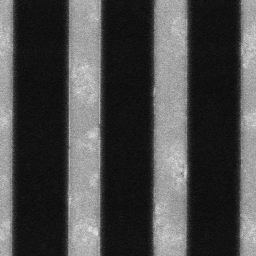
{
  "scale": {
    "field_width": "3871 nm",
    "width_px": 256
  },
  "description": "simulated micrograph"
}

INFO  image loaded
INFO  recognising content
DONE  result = one or a few lines or trenches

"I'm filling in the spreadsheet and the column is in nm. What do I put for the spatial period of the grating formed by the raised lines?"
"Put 1310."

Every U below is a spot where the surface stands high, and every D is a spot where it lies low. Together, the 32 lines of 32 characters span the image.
DDUUUUUUUDDDDUUUUUUDDDDUUUUUUUDD
DDUUUUUUUDDDDUUUUUUDDDDUUUUUUUDD
DDUUUUUUUDDDDUUUUUUDDDDUUUUUUUDD
DDUUUUUUUDDDDUUUUUUDDDDUUUUUUUDD
DDUUUUUUUDDDDUUUUUUDDDDUUUUUUUDD
DDUUUUUUUDDDDUUUUUUDDDDUUUUUUUDD
DDUUUUUUUDDDDUUUUUUDDDDUUUUUUUDD
DUUUUUUUUDDDDUUUUUUDDDDUUUUUUUDD
DUUUUUUUUDDDDUUUUUUDDDDUUUUUUUDD
DDUUUUUUUDDDDUUUUUUDDDDUUUUUUUDD
DDUUUUUUUDDDDUUUUUUDDDDUUUUUUUDD
DDUUUUUUUDDDDUUUUUUDDDDUUUUUUUDD
DDUUUUUUUDDDDUUUUUUDDDDUUUUUUUDD
DUUUUUUUUDDDDUUUUUUDDDDUUUUUUUDD
DDUUUUUUUDDDUUUUUUUDDDDUUUUUUUDD
DUUUUUUUUDDDUUUUUUUDDDDUUUUUUUDD
DDUUUUUUUDDDUUUUUUUDDDDUUUUUUUDD
DDUUUUUUUDDDUUUUUUUDDDDUUUUUUUDD
DDUUUUUUUDDDUUUUUUUDDDDUUUUUUUDD
DDUUUUUUUDDDUUUUUUUDDDDUUUUUUUDD
DUUUUUUUUDDDUUUUUUUDDDDUUUUUUUDD
DUUUUUUUUDDDUUUUUUUDDDDUUUUUUUDD
DUUUUUUUUDDDUUUUUUUDDDDUUUUUUUDD
DDUUUUUUUDDDUUUUUUUDDDDUUUUUUUDD
DUUUUUUUUDDDUUUUUUUDDDDUUUUUUUDD
DUUUUUUUUDDDUUUUUUUDDDDUUUUUUUDD
DUUUUUUUUDDDUUUUUUUDDDDUUUUUUUDD
DUUUUUUUUDDDUUUUUUUDDDDUUUUUUUDD
DUUUUUUUUDDDUUUUUUUDDDDUUUUUUUDD
DUUUUUUUUDDDUUUUUUUDDDDUUUUUUUDD
DUUUUUUUUDDDUUUUUUUDDDDUUUUUUUDD
DUUUUUUUUDDDUUUUUUUDDDDUUUUUUUDD